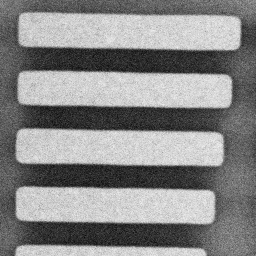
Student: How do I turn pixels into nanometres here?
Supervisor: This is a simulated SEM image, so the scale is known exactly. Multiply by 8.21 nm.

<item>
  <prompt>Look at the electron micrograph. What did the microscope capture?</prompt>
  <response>groups of lines, slits or small figures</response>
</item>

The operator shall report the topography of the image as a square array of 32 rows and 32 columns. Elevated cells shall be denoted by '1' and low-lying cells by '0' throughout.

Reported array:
00000000000000000000000000000000
00000000000000000000000000000000
00111111111111111111111111111100
00111111111111111111111111111100
00111111111111111111111111111100
00011111111111111111111111111100
00000000000000000000000000000000
00000000000000000000000000000000
00000000000000000000000000000000
00111111111111111111111111110000
00111111111111111111111111111000
00111111111111111111111111111000
00111111111111111111111111111000
00000000000000000000000000000000
00000000000000000000000000000000
00000000000000000000000000000000
00111111111111111111110000000000
00111111111111111111111111110000
00111111111111111111111111110000
00111111111111111111111111110000
00000000000001111111111111110000
00000000000000000000000000000000
00000000000000000000000000000000
00011000000000000000000000000000
00111111111111111111111111100000
00111111111111111111111111100000
00111111111111111111111111100000
00011111111111111111111111100000
00000000000000000000000000000000
00000000000000000000000000000000
00000000000000000000000000000000
00111111111111111111111111000000